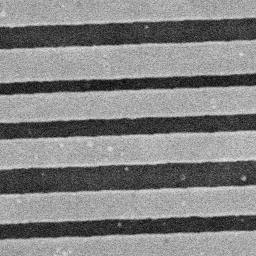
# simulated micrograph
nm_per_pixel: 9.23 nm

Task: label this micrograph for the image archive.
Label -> lines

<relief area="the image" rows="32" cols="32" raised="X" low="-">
XXXXXXXXXXXXXXXXXXXXXXXXXXXXXXXX
XXXXXXXXXXXXXXXXXXXXXXXXXXXXXXXX
XXXXXXXXXXXXXXXXXXXXXXX---------
--------------------------------
--------------------------------
------------------------XXXXXXXX
XXXXXXXXXXXXXXXXXXXXXXXXXXXXXXXX
XXXXXXXXXXXXXXXXXXXXXXXXXXXXXXXX
XXXXXXXXXXXXXXXXXXXXXXXXXXXXXXXX
XXXXXXXXXXXXXXXXXXXXX-----------
--------------------------------
-------------XXXXXXXXXXXXXXXXXXX
XXXXXXXXXXXXXXXXXXXXXXXXXXXXXXXX
XXXXXXXXXXXXXXXXXXXXXXXXXXXXXXXX
XXXXXXXXXXXXXXXXXXXXXX----------
--------------------------------
------------------------------XX
--XXXXXXXXXXXXXXXXXXXXXXXXXXXXXX
XXXXXXXXXXXXXXXXXXXXXXXXXXXXXXXX
XXXXXXXXXXXXXXXXXXXXXXXXXXXXXXXX
XXXXXXXXXXXXXXXXXXXX------------
--------------------------------
--------------------------------
--------------------------XXXXXX
XXXXXXXXXXXXXXXXXXXXXXXXXXXXXXXX
XXXXXXXXXXXXXXXXXXXXXXXXXXXXXXXX
XXXXXXXXXXXXXXXXXXXXXXXXXXXXXXXX
XXXXXXXXXXX---------------------
--------------------------------
--------------XXXXXXXXXXXXXXXXXX
XXXXXXXXXXXXXXXXXXXXXXXXXXXXXXXX
XXXXXXXXXXXXXXXXXXXXXXXXXXXXXXXX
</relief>